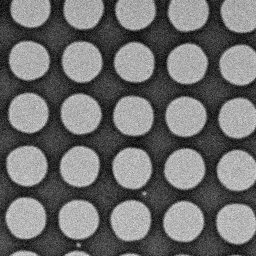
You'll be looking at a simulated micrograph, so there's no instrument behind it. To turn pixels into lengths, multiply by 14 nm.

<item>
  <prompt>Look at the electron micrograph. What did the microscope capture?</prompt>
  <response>an array of small figures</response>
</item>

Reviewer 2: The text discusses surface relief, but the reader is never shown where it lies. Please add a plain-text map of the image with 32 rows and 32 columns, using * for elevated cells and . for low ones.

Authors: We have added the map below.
.*****..*****..****..*****..****
.*****..*****..****..*****..****
..****..****...****..*****..****
..........*.....**....***....***
................................
..***....**.....**..............
.*****..****...****...***...****
.*****..*****.*****..*****..****
.*****..*****.*****..*****..****
..***....***...****..****...****
.............................**.
................................
..***...****...***....**.....**.
.*****..****..*****..****...****
.*****..*****.*****..*****.*****
..****..****..*****..****..*****
...*.....**....***....***...***.
................................
..***....**.....................
.****...****...***...****...***.
.*****..****..*****..****..*****
.*****..****..*****..*****.*****
..***...****...***...****...****
......................**.....**.
................................
.****...***....***....**........
.*****..****..*****..****...****
.*****.*****..*****..****..*****
.****...****..*****..****..*****
..**.....**....***...****...****
................................
..**............................